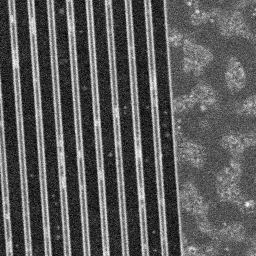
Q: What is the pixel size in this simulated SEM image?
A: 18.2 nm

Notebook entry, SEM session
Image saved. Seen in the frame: parallel lines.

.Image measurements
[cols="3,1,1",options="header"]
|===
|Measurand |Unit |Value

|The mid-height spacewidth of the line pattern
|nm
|254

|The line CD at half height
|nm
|102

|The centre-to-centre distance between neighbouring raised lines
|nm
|352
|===